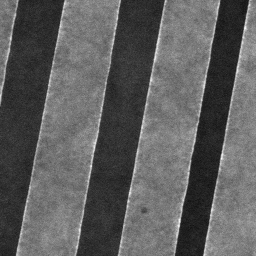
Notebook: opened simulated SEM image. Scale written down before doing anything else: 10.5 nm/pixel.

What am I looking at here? lines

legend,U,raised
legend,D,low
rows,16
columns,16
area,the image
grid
UDDDUUUDDDUUUUDD
UDDDUUUDDDUUUDDU
UDDDUUUDDDUUUDDU
UDDUUUUDDDUUUDDU
DDDUUUUDDUUUUDDU
DDDUUUUDDUUUUDDU
DDDUUUDDDUUUUDUU
DDDUUUDDDUUUDDUU
DDUUUUDDDUUUDDUU
DDUUUUDDDUUUDDUU
DDUUUUDDUUUUDDUU
DDUUUUDDUUUUDUUU
DDUUUDDDUUUUDUUU
DUUUUDDDUUUDDUUU
DUUUUDDDUUUDDUUU
DUUUUDDUUUUDDUUU